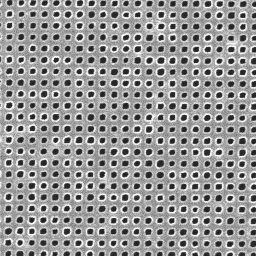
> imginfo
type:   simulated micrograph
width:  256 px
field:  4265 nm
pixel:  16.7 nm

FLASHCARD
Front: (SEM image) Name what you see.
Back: a regular array of holes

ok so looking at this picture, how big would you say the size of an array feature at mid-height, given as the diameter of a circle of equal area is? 0.108 micrometres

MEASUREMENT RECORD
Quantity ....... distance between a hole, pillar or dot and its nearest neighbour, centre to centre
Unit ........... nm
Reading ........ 187